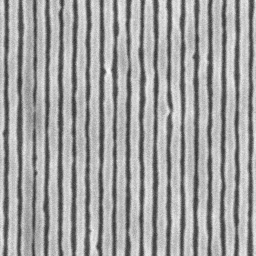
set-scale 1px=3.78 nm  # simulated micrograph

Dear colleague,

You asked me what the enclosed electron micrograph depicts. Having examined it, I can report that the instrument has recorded parallel lines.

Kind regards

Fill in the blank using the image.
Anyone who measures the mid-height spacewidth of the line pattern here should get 18.4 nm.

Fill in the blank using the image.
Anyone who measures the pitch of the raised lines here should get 51.3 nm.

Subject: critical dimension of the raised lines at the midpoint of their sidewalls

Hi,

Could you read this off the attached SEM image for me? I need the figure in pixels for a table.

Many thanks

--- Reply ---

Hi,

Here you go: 8.62